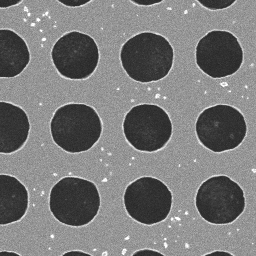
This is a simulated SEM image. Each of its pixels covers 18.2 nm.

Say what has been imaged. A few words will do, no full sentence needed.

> a regular array of holes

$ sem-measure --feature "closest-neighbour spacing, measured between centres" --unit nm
1310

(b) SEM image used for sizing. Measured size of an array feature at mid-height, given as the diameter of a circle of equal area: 881 nanometres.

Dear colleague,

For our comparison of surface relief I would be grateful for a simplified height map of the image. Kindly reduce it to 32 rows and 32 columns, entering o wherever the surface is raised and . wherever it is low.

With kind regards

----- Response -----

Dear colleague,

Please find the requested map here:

..oooooo...oooooo..oooooo....ooo
oooooooooooooooooooooooooooooooo
oooooooooooooooooooooooooooooooo
oooooooooooooooooooooooooooooooo
..oooooo...oooooo...oooooo...ooo
...oooo.....oooo.....oooo.....oo
....oo......ooo.......oo......oo
....ooo.....ooo.......ooo.....oo
...oooo.....ooo......oooo.....oo
..oooooo...ooooo.....ooooo..oooo
oooooooooooooooooooooooooooooooo
oooooooooooooooooooooooooooooooo
oooooooooooooooooooooooooooooooo
..oooooo...oooooo...oooooo...ooo
...oooo.....oooo.....oooo.....oo
....oo.......oo......oooo......o
....oo.......oo......oooo......o
...oooo.....oooo.....oooo.....oo
..oooooo...oooooo...oooooo...ooo
oooooooooooooooooooooooooooooooo
oooooooooooooooooooooooooooooooo
oooooooooooooooooooooooooooooooo
..oooooo...oooooo...oooooo...ooo
...oooo.....oooo.....oooo.....oo
...ooo......oooo.....oooo.....oo
...ooo......oooo.....oooo......o
...ooo......oooo.....oooo.....oo
..ooooo....oooooo...oooooo...ooo
oooooooooooooooooooooooooooooooo
oooooooooooooooooooooooooooooooo
oooooooooooooooooooooooooooooooo
.oooooooo.ooooooo...ooooooo.oooo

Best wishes